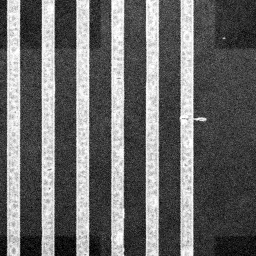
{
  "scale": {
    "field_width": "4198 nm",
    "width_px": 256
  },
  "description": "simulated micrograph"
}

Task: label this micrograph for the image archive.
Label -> parallel lines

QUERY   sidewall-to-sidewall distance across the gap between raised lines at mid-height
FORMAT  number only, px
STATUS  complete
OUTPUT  23.8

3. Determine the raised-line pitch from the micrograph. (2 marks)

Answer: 570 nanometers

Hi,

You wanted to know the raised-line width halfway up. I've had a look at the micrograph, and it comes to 182 nm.